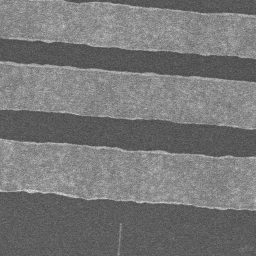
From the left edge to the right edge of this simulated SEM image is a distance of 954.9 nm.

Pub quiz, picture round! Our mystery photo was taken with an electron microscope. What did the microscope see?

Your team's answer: one or a few lines or trenches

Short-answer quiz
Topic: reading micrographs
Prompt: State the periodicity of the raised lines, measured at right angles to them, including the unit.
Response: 75.1 px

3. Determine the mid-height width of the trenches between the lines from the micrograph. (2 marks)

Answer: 26.7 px